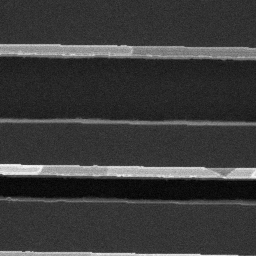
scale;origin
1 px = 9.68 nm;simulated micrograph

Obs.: lines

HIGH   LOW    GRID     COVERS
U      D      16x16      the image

UUUUUUUUUUUUUUUU
UUUUUUUUUUUUUUUU
UUUUUUUUUUUUUUUU
DDDDDDDDUUUUUUUU
DDDDDDDDDDDDDDDD
DDDDDDDDDDDDDDDD
DDDDDDDDDDDDDDDD
DDDDDDDDDDDDDDDD
UUUUUUUUUUUUUUUU
UUUUUUUUUUUUUUUU
UUUUUUUUUUUUUUUU
DDDDDDDDDDDDDDDD
UUDDDDDDDDDDDDDD
UUUUUUUUUUUUUUUU
UUUUUUUUUUUUUUUU
UUUUUUUUUUUUUUUU